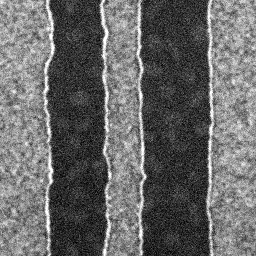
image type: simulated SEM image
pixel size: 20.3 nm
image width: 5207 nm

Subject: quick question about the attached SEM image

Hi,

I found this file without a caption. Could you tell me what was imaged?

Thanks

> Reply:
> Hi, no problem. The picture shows one or a few lines or trenches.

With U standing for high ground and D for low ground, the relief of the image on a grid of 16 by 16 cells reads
DDDUUUDDDUUUUDDD
DDDUUUUDDUUUUDDD
DDDUUUUDDUUUUDDD
DDDUUUUDDUUUUDDD
DDDUUUUDDUUUUDDD
DDDUUUUDDUUUUDDD
DDDUUUUDDUUUUDDD
DDDUUUUDDUUUUDDD
DDDUUUUDDUUUUDDD
DDDUUUUDDUUUUDDD
DDDUUUUDDUUUUDDD
DDDUUUUDDUUUUDDD
DDDUUUUDDUUUUDDD
DDDUUUUDDUUUUDDD
DDDUUUUDDUUUUDDD
DDDUUUUDDUUUUDDD